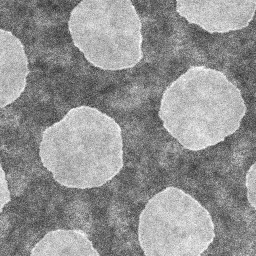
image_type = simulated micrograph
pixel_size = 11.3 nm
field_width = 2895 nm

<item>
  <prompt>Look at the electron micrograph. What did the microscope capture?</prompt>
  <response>raised bodies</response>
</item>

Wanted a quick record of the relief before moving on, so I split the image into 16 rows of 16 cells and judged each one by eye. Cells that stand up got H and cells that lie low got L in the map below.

LLLLLHHHLLLHHHHH
LLLLHHHHHLLLHHHL
HLLLLHHHHLLLLLLL
HHLLLHHHHLLLLLLL
HHLLLLLLLLLLHHLL
HLLLLLLLLLLHHHHL
LLLLLLLLLLHHHHHL
LLLLHHHLLLHHHHHL
LLLHHHHHLLLHHHLL
LLLHHHHHLLLLLLLL
LLLHHHHLLLLLLLLL
LLLLHHLLLLLLLLLH
LLLLLLLLLHHHLLLL
LLLLLLLLLHHHHLLL
LLLHHLLLLHHHHLLL
LLHHHHLLLHHHHLLL